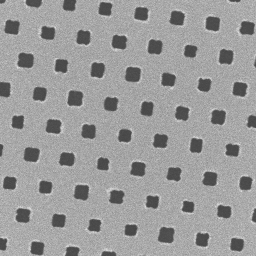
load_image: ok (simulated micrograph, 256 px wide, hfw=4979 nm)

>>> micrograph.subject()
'a regular array of holes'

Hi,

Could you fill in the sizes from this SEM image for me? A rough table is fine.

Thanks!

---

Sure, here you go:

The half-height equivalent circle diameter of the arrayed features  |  289 nanometers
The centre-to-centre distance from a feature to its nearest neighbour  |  687 nanometres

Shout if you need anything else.